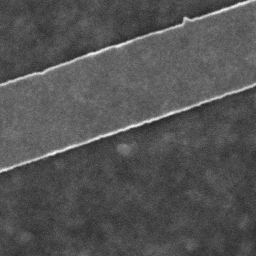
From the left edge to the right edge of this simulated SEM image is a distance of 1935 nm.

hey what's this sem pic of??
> one or a few lines or trenches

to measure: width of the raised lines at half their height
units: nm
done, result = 628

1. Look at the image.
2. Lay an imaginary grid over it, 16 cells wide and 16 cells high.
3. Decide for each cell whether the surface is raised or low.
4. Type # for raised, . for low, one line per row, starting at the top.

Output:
..............##
...........#####
........########
.....###########
...#############
###############.
############....
##########......
#######.........
####............
#...............
................
................
................
................
................